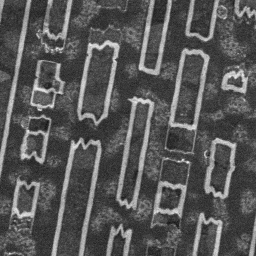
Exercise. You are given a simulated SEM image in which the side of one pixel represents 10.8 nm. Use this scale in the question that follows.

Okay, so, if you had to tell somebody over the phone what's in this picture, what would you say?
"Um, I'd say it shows parallel lines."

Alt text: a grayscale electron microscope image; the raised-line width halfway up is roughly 0.227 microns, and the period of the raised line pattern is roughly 498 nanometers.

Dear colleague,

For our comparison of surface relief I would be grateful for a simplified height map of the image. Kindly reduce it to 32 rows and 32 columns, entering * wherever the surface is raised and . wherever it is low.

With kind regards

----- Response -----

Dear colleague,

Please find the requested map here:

****..***..........**...***...**
***...***..........**...***...**
***...**...........**...***.....
***...**..........***...***.....
***...**..........**.....*......
***..........*....**............
***........****...**...*........
**.........***....**...***......
**...**....***....**...***......
**...**....***........***...**..
**..****..****........***...***.
**........****........***.......
*.........***.........***.......
*.........***....**...***.......
*.........***....**...***.......
*...............***...**........
*...............**..............
*..***..........**..............
...***...***....**.........**...
...**....***....**........***...
.........***....**........***...
........****...**.........***...
........****...**.........***...
..***...****...**...***...**....
..***...***....**...***.........
..**....***.....*...***.........
..**....***.....................
.......****..............*......
.......****..............**.....
.......***....**.........**.....
.......***....**.........**.....
.......***....**........***....*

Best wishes